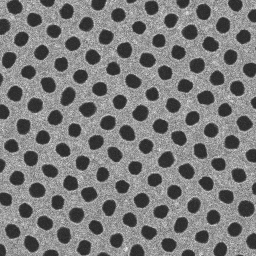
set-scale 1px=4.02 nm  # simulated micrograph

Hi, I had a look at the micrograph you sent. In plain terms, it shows a regular array of holes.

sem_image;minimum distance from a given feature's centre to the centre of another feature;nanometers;91.7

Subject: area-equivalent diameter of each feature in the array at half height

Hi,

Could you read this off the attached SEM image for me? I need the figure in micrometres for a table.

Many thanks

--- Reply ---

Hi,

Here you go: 0.0571